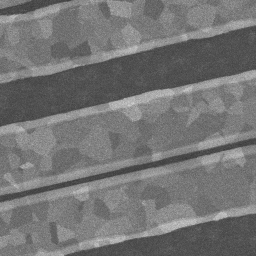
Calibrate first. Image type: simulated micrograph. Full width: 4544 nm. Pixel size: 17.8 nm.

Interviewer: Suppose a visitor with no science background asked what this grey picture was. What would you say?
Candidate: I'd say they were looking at one or a few lines or trenches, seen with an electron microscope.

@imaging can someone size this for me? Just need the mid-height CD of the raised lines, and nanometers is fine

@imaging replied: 1020